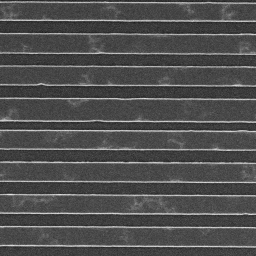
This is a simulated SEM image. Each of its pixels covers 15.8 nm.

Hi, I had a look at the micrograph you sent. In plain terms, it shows parallel lines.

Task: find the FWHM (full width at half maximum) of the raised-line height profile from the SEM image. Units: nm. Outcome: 312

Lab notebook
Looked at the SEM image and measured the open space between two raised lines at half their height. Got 200 nm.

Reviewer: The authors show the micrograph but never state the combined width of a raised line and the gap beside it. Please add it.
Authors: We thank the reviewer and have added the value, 508 nm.